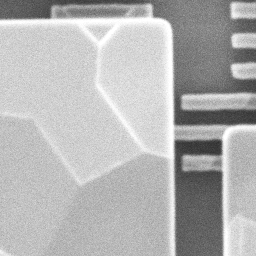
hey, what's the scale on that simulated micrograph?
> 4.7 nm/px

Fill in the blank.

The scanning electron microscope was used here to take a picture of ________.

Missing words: wiring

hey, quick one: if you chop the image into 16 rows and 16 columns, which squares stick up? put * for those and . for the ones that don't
................
**********......
***********.....
***********.....
***********.....
***********.....
***********.....
***********.....
***********...**
***********...**
***********...**
***********...**
***********...**
***********...**
***********...**
***********...**